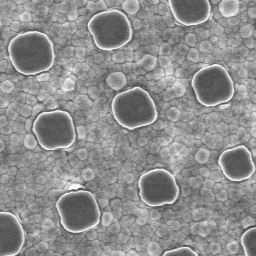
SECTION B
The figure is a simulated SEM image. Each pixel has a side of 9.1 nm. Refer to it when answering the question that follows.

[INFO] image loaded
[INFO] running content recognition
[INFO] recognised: a regular array of raised bodies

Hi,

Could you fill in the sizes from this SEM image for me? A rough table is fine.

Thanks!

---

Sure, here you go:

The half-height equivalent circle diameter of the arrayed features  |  0.373 microns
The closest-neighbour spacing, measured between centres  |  745 nanometers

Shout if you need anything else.